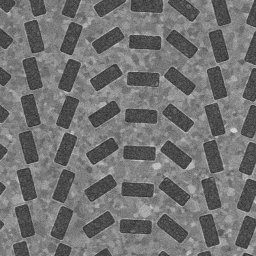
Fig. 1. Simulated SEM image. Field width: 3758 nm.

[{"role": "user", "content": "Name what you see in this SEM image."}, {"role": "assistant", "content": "an array of small figures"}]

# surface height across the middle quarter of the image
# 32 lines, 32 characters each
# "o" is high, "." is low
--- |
....oooooooo..oooooooooooooooooo
....oooooo....oooooooooooo..oooo
...oooooo......o........o.....oo
...oooo.......oo........o......o
...oooo.....oooo........oo......
..ooooo...oooooo.......ooooo....
..oooooo.oooooooooooooooooooo...
oooooooooooooooooooooooooooooo..
...ooooooooooooooooooooooooooooo
....oooooooo.ooooooooooooooooooo
...ooooooo....oooooooooooo..oooo
...ooooo......oo.......oo....ooo
...oooo......oo.........o.....oo
..oooo......ooo.........oo.....o
..oooo.....ooooo.......oooo.....
.oooooo..ooooooooooooooooooo....
ooooooooooooooooooooooooooooo..o
..oooooooooooooooooooooooooooooo
...oooooooo.oooooooooooooooooooo
...ooooooo...oooooooooooo..ooooo
...ooooo......o.......ooo...oooo
..ooooo......oo........o......oo
..oooo......ooo........oo......o
.ooooo....ooooo........ooo......
.ooooo...oooooooooooooooooo.....
ooooooooooooooooooooooooooooo..o
.ooooooooooooooooooooooooooooooo
...ooooooooooooooooooooooooooooo
...ooooooo..ooooooooooooo.oooooo
..oooooo.....oo.oooooooo...ooooo
..ooooo......o.........o.....ooo
..ooo.......oo.........o......oo